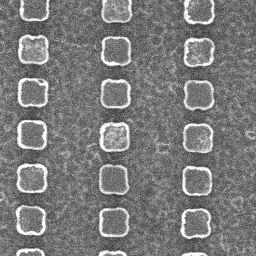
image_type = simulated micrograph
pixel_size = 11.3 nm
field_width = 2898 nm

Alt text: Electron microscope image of a regular array of raised bodies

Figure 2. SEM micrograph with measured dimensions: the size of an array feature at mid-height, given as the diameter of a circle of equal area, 348 nm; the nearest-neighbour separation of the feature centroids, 482 nm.